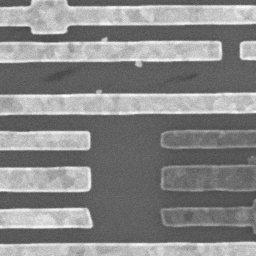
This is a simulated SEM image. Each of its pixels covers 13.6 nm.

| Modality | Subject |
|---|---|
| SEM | wiring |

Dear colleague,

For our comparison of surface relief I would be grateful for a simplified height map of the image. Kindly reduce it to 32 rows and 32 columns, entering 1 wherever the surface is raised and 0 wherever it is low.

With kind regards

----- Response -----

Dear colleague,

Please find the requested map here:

00001111000000000000000000000000
11111111111111111111111111111111
11111111111111111111111111111111
00001111000000000000000000000000
00000000000000000000000000000000
11111111111111111111111111110011
11111111111111111111111111110011
11111111111111100011110000000000
00000000000000000000000000000000
00000000000000000000000000000000
00000000000000000000000000000000
00000000000000000000000000000000
11111111111111111111111111111111
11111111111111111111111111111111
00000000000000000000000000000000
00000000000000000000000000000000
00000000000000000000011111111111
11111111111000000000111111111111
11111111111000000000011000000000
00000000000000000000000000000000
00000000000000000000000000000000
11111111111000000000111111111111
11111111111000000000111111111111
11111111111000000000111111111111
00000000000000000000000000000000
00000000000000000000000000000000
11111111111000000000111111111111
11111111111000000000111111111111
00000000000000000000000000000000
00000000000000000000000000000000
00000000000000000000111100011111
11111111111111111111111111111111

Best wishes